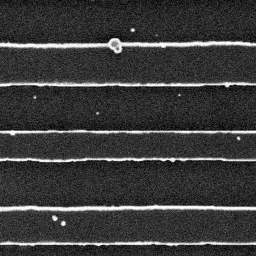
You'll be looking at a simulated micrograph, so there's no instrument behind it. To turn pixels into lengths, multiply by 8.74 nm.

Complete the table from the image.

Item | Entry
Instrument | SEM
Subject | lines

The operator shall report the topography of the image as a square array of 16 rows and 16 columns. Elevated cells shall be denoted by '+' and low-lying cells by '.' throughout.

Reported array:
................
................
................
++++++++++++++++
++++++++++++++++
................
................
................
++++++++++++++++
++++++++++++++++
................
................
................
++++++++++++++++
++++++++++++++++
................